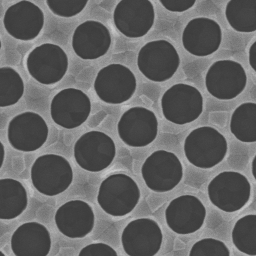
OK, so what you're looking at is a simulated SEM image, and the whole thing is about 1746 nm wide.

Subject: a regular array of holes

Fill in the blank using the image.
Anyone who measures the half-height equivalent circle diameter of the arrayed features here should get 0.275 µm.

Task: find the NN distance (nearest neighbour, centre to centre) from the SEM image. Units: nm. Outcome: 335